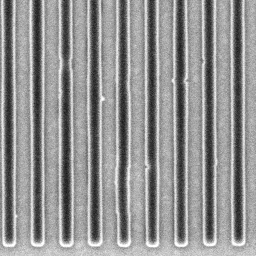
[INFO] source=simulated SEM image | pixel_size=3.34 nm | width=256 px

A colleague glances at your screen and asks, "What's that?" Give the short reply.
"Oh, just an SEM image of parallel lines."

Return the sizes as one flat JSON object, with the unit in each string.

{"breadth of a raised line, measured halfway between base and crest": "43.4 nm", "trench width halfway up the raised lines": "52.2 nm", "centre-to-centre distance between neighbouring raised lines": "95.7 nm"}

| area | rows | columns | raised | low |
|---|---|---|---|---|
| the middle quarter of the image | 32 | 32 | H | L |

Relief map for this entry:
HHLLLLHHHLLLLHHHLLLLHHHLLLLHHHHL
HHLLLLHHHLLLLHHHLLLLHHHLLLLHHHHL
HHLLLLHHHLLLLHHHLLLLHHHHLLLHHHHL
HHLLLLHHHLLLLHHHLLLLHHHHLLLHHHHL
HHLLLLHHHLLLLHHHLLLLHHHHLLLHHHHL
HHLLLLHHHLLLLHHHLLLLHHHHLLLHHHHL
HHLLLLHHHLLLLHHHLLLLHHHHLLLHHHHL
HHLLLLHHHLLLLHHHLLLLLHHHLLLHHHHL
HHLLLLHHHHLLLHHHLLLLLHHHLLLHHHHL
HHLLLLHHHLLLLHHHLLLLLHHHLLLHHHHL
HHLLLLHHHLLLLHHHLLLLLHHHLLLHHHHL
HHLLLLHHHLLLLHHHLLLLLHHHLLLHHHHL
HHLLLLHHHLLLLHHHLLLLLHHHLLLHHHHL
HHLLLLHHHLLLLHHHLLLLLHHHLLLLHHHL
HHLLLLHHHLLLLHHHLLLLLHHHLLLLHHHL
HHLLLLHHHLLLLHHHLLLLLHHHLLLLHHHL
HHLLLLHHHLLLLHHHLLLLLHHHLLLLHHHL
HHLLLLHHHLLLLHHHLLLLLHHHLLLLHHHL
HHLLLLHHHLLLLHHHLLLLLHHHLLLLHHHL
HHLLLLHHHLLLLHHHLLLLLHHHLLLLHHHL
HHLLLLHHHLLLLHHHLLLLLHHHLLLLHHHL
HHLLLLHHHLLLLHHHLLLLLHHHLLLLHHHL
HHLLLLHHHLLLLHHHLLLLLHHHLLLLHHHL
HHLLLLHHHLLLLHHHLLLLLHHHLLLLHHHL
HHLLLLHHHLLLLHHHLLLLLHHHLLLLHHHL
HHLLLLHHHLLLLHHHLLLLLHHHLLLLHHHL
HHLLLLHHHLLLLHHHLLLLLHHHLLLLHHHL
HHLLLLHHHLLLLHHHLLLLLHHHLLLLHHHL
HHLLLLHHHLLLLHHHLLLLLHHHLLLLHHHL
HHLLLLHHHLLLLHHHLLLLLHHHLLLLHHHL
HHLLLLHHHLLLLHHHLLLLLHHHLLLLHHHL
HHLLLLHHHLLLLHHHLLLLLHHHLLLLHHHL